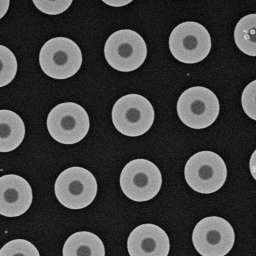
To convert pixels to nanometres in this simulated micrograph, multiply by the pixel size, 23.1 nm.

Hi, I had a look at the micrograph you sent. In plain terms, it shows an array of small figures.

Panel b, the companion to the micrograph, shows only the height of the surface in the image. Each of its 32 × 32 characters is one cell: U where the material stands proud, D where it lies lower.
UDDDUUUUUDDDDUUUDDDDDDDDDDDDDDDD
UDDDDUUUDDDDDDDDDDDDDDDDDDDDDDDD
DDDDDDDDDDDDDDDDDDDDDDDDDDDDDDUU
DDDDDDDDDDDDDDDDDDDDDDUUUUDDDUUU
DDDDDDDDDDDDDDUUUUDDDUUUUUDDDUUU
DDDDDDUUUDDDDUUUUUDDDUUUUUDDDDUU
UDDDDUUUUUDDDUUUUUDDDUUUUUDDDDUU
UUDDDUUUUUDDDUUUUUDDDDUUUDDDDDDD
UUDDDUUUUUDDDDUUUDDDDDDDDDDDDDDD
UUDDDDUUUDDDDDDDDDDDDDDDDDDDDDDD
UDDDDDDDDDDDDDDDDDDDDDDDDDDDDDDU
DDDDDDDDDDDDDDDDDDDDDDDUUUDDDDUU
DDDDDDDDDDDDDDDUUUDDDDUUUUUDDDUU
DDDDDDDUUUDDDDUUUUUDDDUUUUUDDDUU
UUDDDDUUUUUDDDUUUUUDDDUUUUUDDDDU
UUUDDDUUUUUDDDUUUUUDDDDUUUDDDDDD
UUUDDDUUUUUDDDDUUUDDDDDDDDDDDDDD
UUUDDDDUUUDDDDDDDDDDDDDDDDDDDDDD
UUDDDDDDDDDDDDDDDDDDDDDDDDDDDDDD
DDDDDDDDDDDDDDDDDDDDDDDDUUUDDDDU
DDDDDDDDDDDDDDDDUUUDDDDUUUUUDDDU
DDDDDDDDUUUDDDDUUUUUDDDUUUUUDDDU
UUUDDDDUUUUUDDDUUUUUDDDUUUUUDDDD
UUUUDDDUUUUUDDDUUUUUDDDDUUUDDDDD
UUUUDDDUUUUUDDDDUUUDDDDDDDDDDDDD
UUUUDDDDUUUDDDDDDDDDDDDDDDDDDDDD
UUUDDDDDDDDDDDDDDDDDDDDDDDDDDDDD
DDDDDDDDDDDDDDDDDDDDDDDDDUUUDDDD
DDDDDDDDDDDDDDDDDUUUDDDDUUUUUDDD
DDDDDDDDDUUUDDDDUUUUUDDDUUUUUDDD
DUUUDDDDUUUUUDDDUUUUUDDDUUUUUDDD
UUUUUDDDUUUUUDDDUUUUUDDDDUUUUDDD